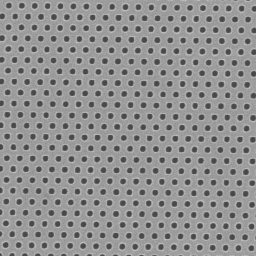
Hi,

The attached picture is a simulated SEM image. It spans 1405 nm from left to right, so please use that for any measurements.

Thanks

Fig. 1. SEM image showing a regular array of holes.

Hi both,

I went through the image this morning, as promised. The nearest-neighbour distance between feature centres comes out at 67.7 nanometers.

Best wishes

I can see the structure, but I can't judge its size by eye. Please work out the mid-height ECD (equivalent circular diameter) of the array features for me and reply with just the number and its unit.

32.2 nm